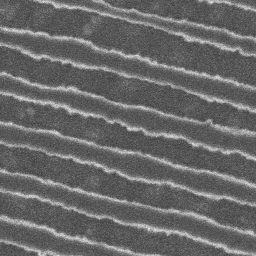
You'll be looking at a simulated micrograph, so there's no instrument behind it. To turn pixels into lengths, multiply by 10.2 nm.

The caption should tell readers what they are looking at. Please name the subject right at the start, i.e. parallel lines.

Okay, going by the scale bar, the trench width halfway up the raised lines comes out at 269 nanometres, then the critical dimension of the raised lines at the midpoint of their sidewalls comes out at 0.217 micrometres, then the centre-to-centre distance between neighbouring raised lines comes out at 485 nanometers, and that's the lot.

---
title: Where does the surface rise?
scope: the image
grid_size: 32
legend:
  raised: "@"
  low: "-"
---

-------@@@@@@----------------@@@
------------@@@@@---------------
----------------@@@@@@----------
-------------------@@@@@@@@-----
@@@@@@-----------------@@@@@@@--
@@@@@@@@@@@----------------@@@@@
---@@@@@@@@@@@@---------------@@
-------@@@@@@@@@@@--------------
-----------@@@@@@@@@@@----------
@@--------------@@@@@@@@@@------
@@@@----------------@@@@@@@@@@--
@@@@@@@@@@-------------@@@@@@@@@
---@@@@@@@@@@@------------@@@@@@
--------@@@@@@@@@@------------@@
------------@@@@@@@@@@----------
@@-------------@@@@@@@@@@@@-----
@@@@@@@-----------@@@@@@@@@@@@@-
@@@@@@@@@@-------------@@@@@@@@@
----@@@@@@@@@@------------@@@@@@
-------@@@@@@@@@@@@------------@
------------@@@@@@@@@-----------
@-------------@@@@@@@@@@@@------
@@@@@-------------@@@@@@@@@@@@--
@@@@@@@@@--------------@@@@@@@@@
---@@@@@@@@@@-------------@@@@@@
-------@@@@@@@@@@--------------@
----------@@@@@@@@@@@@@---------
@-------------@@@@@@@@@@@@------
@@@@@@------------@@@@@@@@@@@---
@@@@@@@@----------------@@@@@@@@
-@@@@@@@@@@@@-------------@@@@@@
-----@@@@@@@@@@@-------------@@@